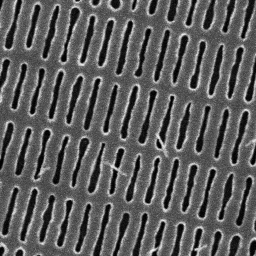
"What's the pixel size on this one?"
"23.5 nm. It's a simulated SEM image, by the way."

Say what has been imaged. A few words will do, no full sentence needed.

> a regular array of holes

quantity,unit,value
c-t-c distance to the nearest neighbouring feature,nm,443